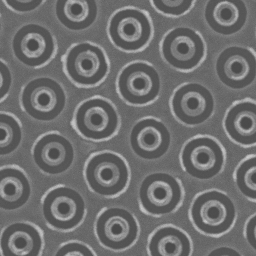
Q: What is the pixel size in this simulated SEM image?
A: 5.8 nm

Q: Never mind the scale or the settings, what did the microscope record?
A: a regular array of ring-shaped grooves with a dot in the middle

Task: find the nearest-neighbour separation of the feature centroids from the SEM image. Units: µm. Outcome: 0.319